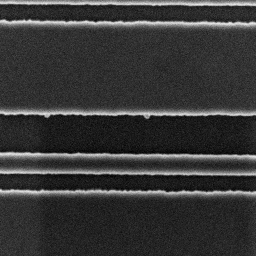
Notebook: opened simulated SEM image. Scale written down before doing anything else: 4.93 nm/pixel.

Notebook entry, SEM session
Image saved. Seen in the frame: lines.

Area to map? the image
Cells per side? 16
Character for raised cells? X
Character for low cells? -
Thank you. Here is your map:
XXXXXXXXXXXXXXXX
XXXXXXXXXXXXXXXX
XXXXXXXXXXXXXXXX
XXXXXXXXXXXXXXXX
XXXXXXXXXXXXXXXX
XXXXXXXXXXXXXXXX
XXXXXXXXXXXXXXXX
----------------
----------------
----------------
XXXXXXXXXXXXXXXX
XXXXXXXXXXXXXXXX
XXXXXXXXXXXXXXXX
XXXXXXXXXXXXXXXX
XXXXXXXXXXXXXXXX
XXXXXXXXXXXXXXXX